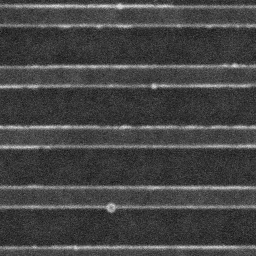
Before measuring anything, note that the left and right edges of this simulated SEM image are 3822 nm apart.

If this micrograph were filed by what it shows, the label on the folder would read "lines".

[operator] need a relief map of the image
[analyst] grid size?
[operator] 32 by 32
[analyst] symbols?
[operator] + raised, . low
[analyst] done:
................................
++++++++++++++++++++++++++++++++
++++++++++++++++++++++++++++++++
................................
................................
................................
................................
................................
++++++++++++++++++++++++++++++++
++++++++++++++++++++++++++++++++
++++++++++++++++++++++++++++++++
................................
................................
................................
................................
................................
++++++++++++++++++++++++++++++++
++++++++++++++++++++++++++++++++
................................
................................
................................
................................
................................
++++++++++++++++++++++++++++++++
++++++++++++++++++++++++++++++++
++++++++++++++++++++++++++++++++
................................
................................
................................
................................
................................
++++++++++++++++++++++++++++++++